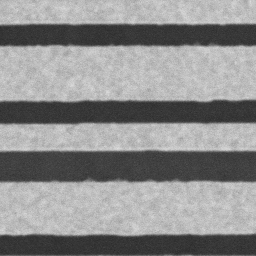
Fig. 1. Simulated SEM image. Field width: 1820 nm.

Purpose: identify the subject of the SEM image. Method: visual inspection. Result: lines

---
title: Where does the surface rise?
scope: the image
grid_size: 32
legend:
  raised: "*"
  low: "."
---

********************************
********************************
********************************
................................
................................
................................
********************************
********************************
********************************
********************************
********************************
********************************
****************.**********.***.
................................
................................
.........****...****************
********************************
********************************
********************************
................................
................................
................................
................................
********************************
********************************
********************************
********************************
********************************
********************************
................................
................................
................................